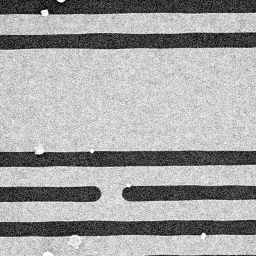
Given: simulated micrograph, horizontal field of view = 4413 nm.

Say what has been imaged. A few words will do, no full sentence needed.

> groups of lines, slits or small figures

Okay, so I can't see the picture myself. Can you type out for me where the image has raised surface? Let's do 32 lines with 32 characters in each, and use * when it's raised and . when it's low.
................................
.....*..........................
********************************
********************************
................................
................................
********************************
********************************
********************************
********************************
********************************
********************************
********************************
********************************
********************************
********************************
********************************
********************************
********************************
................................
................................
********************************
********************************
............****................
.............**.................
********************************
********************************
***********..*******............
................................
.........*....******..**********
********************************
********************************